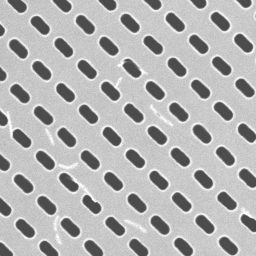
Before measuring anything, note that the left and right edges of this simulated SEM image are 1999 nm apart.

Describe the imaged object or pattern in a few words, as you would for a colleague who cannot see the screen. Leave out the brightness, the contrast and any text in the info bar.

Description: a regular array of holes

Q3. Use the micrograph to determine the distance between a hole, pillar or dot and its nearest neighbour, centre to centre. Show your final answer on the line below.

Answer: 246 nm